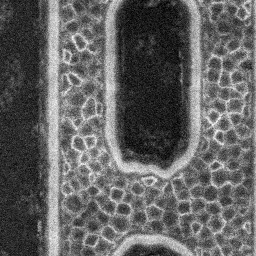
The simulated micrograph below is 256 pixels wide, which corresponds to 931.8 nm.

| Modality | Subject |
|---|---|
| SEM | one or a few lines or trenches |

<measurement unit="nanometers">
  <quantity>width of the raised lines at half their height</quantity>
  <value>215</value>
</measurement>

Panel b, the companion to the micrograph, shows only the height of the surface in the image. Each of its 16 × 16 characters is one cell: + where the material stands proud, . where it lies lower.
...++++.....++++
...++++.....++++
...++++.....++++
...++++.....++++
...++++.....++++
...++++.....++++
...++++.....++++
...++++.....++++
...++++.....++++
...++++.....++++
...++++++..+++++
...+++++++++++++
...+++++++++++++
...+++++++++++++
...+++++++++++++
...+++++...+++++